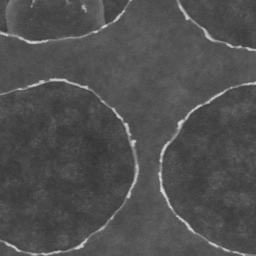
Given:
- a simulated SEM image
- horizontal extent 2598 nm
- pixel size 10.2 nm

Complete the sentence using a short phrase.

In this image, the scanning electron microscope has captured holes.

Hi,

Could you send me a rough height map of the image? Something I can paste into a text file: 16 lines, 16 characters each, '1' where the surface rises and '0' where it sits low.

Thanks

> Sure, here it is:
0000000011100000
0000000111110000
1101111111111100
1111111111111111
1111111111111111
1100011111111110
0000000111111000
0000000111110000
0000000011100000
0000000011000000
0000000011000000
0000000011000000
0000000011100000
0000000111100000
0000001111110000
1000011111111100